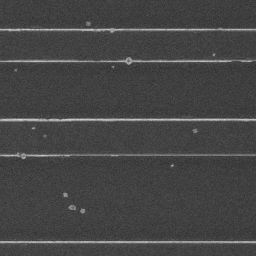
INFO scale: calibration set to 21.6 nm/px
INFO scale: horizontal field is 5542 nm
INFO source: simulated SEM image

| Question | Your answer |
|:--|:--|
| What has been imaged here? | lines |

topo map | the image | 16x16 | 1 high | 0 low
0000000000000000
0000000000000000
1111111111111111
1111111111111111
0000000000000000
0000000000000000
0000000000000000
0000000011011111
1111111111111111
1111111111111111
0000000000000000
0000000000000000
0000000000000000
0000000000000000
0000000000000000
1111111111111111